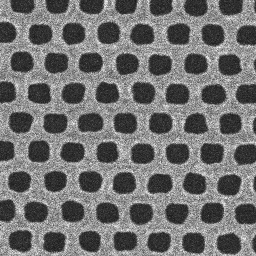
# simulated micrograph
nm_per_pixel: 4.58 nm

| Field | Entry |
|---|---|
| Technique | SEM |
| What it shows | a regular array of holes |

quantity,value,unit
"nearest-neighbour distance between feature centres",153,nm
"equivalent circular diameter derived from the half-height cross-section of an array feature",106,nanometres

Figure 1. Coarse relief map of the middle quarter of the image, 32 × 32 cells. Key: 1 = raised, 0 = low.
01110000001110000001100000011100
01110000011110000011100000011100
11111111111111001111110001111111
11111111111111111111111111111111
11111111111111111100011111111111
00000111000001111000001111000001
00000111000000111000000110000001
00000111000000111000000110000001
00000111000000111000000110000001
00001111100001111100001111000001
11111111111111111111111111111111
11111111111111111111111111111111
11111000011110000111110000111111
01110000001100000011100000011110
01100000001100000011100000011100
01100000001100000011100000011100
11110000011110000011100000011100
11111111111111111111111001111111
11111111111111111111111111111111
10111111110011111111111111111111
00000111000001111000001111000001
00000111000001111000000110000001
00000111000000111000000110000001
00000111000001111000000111000001
10011111100001111000001111000001
11111111111111111111111111111111
11111111111111111111111111111111
11110000011110000111111011111110
01110000001100000011110000011100
01110000001100000011100000011100
11110000011100000011100000011100
11111000011100000011100000011100